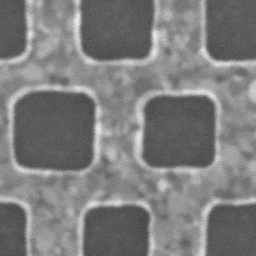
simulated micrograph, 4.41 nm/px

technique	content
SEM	holes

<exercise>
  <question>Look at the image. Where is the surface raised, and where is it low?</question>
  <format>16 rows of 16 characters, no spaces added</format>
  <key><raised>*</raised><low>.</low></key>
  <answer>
..***.....***...
..***.....***...
..***.....***...
.****....****...
****************
****************
*.....***.....**
*.....***.....**
*.....***.....**
*.....***.....**
*.....****...***
****************
****************
..***....****...
..***....****...
..***....****...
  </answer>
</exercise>